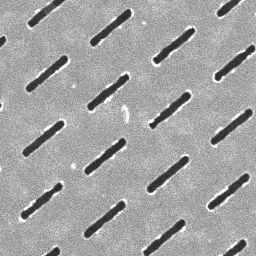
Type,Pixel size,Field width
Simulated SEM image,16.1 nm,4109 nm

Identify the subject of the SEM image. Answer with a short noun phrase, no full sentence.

a regular array of holes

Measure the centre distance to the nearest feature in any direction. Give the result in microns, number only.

1.02